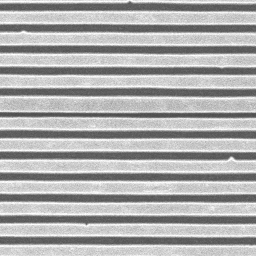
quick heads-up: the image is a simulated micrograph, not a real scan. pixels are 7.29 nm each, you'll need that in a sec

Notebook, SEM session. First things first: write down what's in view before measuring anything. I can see parallel lines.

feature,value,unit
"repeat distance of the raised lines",155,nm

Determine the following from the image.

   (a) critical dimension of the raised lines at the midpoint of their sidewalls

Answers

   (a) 13.4 pixels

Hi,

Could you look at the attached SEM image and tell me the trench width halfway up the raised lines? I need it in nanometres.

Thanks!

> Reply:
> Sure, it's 61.